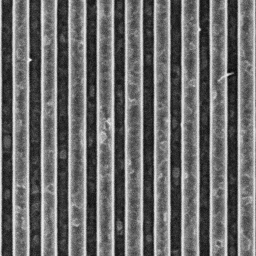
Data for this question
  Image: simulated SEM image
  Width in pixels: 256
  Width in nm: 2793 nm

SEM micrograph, parallel lines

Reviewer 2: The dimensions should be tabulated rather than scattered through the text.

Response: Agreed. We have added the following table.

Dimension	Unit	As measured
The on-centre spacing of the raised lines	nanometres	308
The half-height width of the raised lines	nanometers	171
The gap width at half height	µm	0.134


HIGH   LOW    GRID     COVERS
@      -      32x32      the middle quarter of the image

-@@@@---@@@@----@@@@---@@@----@@
-@@@@---@@@@----@@@@---@@@----@@
-@@@@---@@@@----@@@@---@@@----@@
-@@@@---@@@@----@@@@---@@@----@@
-@@@@---@@@@----@@@@---@@@----@@
-@@@@---@@@@----@@@@---@@@----@@
-@@@@---@@@@----@@@@---@@@----@@
-@@@@---@@@@----@@@@---@@@----@@
-@@@@---@@@@----@@@@---@@@----@@
-@@@@---@@@@----@@@@---@@@----@@
-@@@@---@@@@----@@@@---@@@----@@
-@@@@---@@@@----@@@@---@@@----@@
-@@@@---@@@@----@@@@---@@@----@@
-@@@@---@@@@---@@@@@---@@@----@@
-@@@@---@@@@----@@@@---@@@----@@
-@@@@---@@@@----@@@@---@@@----@@
-@@@@---@@@@----@@@@---@@@----@@
-@@@@---@@@@----@@@@---@@@----@@
-@@@@---@@@@----@@@@---@@@----@@
-@@@@---@@@@----@@@@---@@@----@@
-@@@@---@@@@----@@@@---@@@----@@
-@@@@---@@@@----@@@@---@@@----@@
-@@@@---@@@@----@@@@---@@@----@@
-@@@@---@@@@----@@@@---@@@----@@
-@@@@----@@@----@@@@---@@@----@@
-@@@@---@@@@----@@@@---@@@----@@
-@@@@---@@@@----@@@@---@@@----@@
-@@@@----@@@----@@@@---@@@----@@
-@@@@----@@@----@@@@---@@@----@@
-@@@@----@@@----@@@@---@@@----@@
-@@@@---@@@@----@@@@---@@@----@@
-@@@@---@@@@----@@@@---@@@----@@